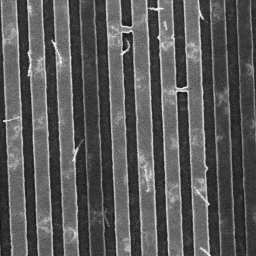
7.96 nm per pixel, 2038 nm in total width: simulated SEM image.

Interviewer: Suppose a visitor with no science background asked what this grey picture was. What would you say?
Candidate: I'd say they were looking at parallel lines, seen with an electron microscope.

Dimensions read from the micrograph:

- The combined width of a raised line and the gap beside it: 0.207 microns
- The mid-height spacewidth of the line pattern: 88.5 nm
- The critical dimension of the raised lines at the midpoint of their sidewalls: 118 nm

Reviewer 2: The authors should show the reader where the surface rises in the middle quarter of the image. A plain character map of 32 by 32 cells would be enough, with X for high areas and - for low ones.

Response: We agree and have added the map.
XX---XXX---XXXX---XXX---XXXX---X
XX---XXX---XXXX---XXX---XXXX---X
XX---XXX---XXXX---XXX---XXXX---X
XX---XXX---XXXX---XXXX--XXXX---X
XX---XXX----XXX---XXXX--XXXX---X
XX---XXX---XXXX---XXXX--XXXX---X
XX---XXX---XXXX---XXX----XXXXXXX
XX---XXX---XXXX---XXXX--XXXX---X
XX---XXXX---XXX---XXXX--XXXX---X
XX---XXXX---XXX---XXXX---XXX---X
XX---XXXX---XXX---XXXX---XXX---X
XX---XXXX---XXX---XXXX---XXX---X
XX---XXXX---XXX---XXXX---XXX---X
XX---XXXX---XXX---XXXX---XXX---X
XX---XXXX---XXX---XXXX---XXX---X
XX---XXXX---XXX---XXXX---XXX---X
XX---XXXX---XXX---XXXX---XXX---X
XX---XXXX---XXX---XXXX---XXX---X
XX---XXXX---XXX---XXXX---XXX---X
XXX---XXX---XXX---XXXX---XXX---X
XXX---XXX---XXXX---XXX---XXX---X
XXX---XXX---XXXX---XXX---XXXX---
XXX---XXX---XXXX---XXX---XXXX---
XXX---XXX---XXXX---XXX---XXXX---
XXX---XXX---XXXX---XXX---XXXX---
XXX---XXX---XXXX---XXX---XXXX---
XXX---XXX---XXXX---XXX---XXXX---
XXX---XXX---XXXX---XXXX---XXX---
XXX---XXX---XXXX---XXX---XXXX---
XXX---XXX---XXXX---XXXX---XXX---
XXX---XXX---XXXX---XXXX--XXXX---
XXX---XXX----XXX---XXXX--XXXX---